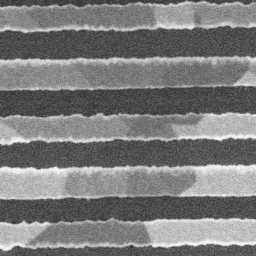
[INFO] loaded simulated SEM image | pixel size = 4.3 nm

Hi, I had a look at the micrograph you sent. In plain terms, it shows lines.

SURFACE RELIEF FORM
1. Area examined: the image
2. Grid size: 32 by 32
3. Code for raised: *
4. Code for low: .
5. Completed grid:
................****..********.*
********************************
********************************
*******************..***........
................................
................................
................................
..............*....*************
********************************
********************************
********************************
................................
................................
................................
.**....*.*.*********************
********************************
********************************
**************..***.*...........
................................
................................
................................
********************************
********************************
********************************
*************..**...............
................................
................................
.........................**.**..
********************************
********************************
*************************..*****
................................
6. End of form